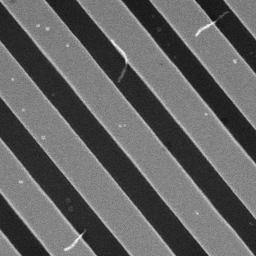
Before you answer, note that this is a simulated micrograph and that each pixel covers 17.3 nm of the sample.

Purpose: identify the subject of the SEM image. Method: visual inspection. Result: lines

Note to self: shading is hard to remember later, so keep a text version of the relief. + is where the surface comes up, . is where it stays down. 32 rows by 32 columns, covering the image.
++++++....++++++...++++++...++++
.++++++....+++++....++++++...+++
..++++++....+++++....++++++...++
...++++++...++++++...++++++....+
....+++++....++++++...++++++....
....++++++....++++++...++++++...
+....++++++....++++++...++++++..
++....++++++....+++++....++++++.
+++....++++++...++++++....+++++.
++++....+++++....++++++...++++++
++++.....+++++....++++++...+++++
+++++....++++++....++++++...++++
++++++....++++++....+++++....+++
.++++++....++++++....+++++....++
..++++++....++++++...++++++...++
...++++++....+++++....++++++...+
....+++++....++++++....++++++...
....++++++....++++++....++++++..
+....++++++....++++++....+++++..
++....++++++....++++++...++++++.
+++....++++++....+++++....++++++
++++....+++++....++++++....+++++
++++.....+++++....++++++....++++
+++++....++++++....++++++....+++
++++++....++++++....++++++....++
.++++++....++++++....++++++...++
..++++++....++++++....+++++....+
...+++++.....+++++....++++++....
...++++++....++++++....++++++...
+...++++++....++++++....++++++..
++...++++++....++++++....++++++.
++....++++++....++++++....+++++.